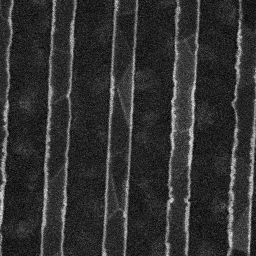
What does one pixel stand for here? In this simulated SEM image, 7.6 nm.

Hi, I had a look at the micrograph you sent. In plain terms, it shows one or a few lines or trenches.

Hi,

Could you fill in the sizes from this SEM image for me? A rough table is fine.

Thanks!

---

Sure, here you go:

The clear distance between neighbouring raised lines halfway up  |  41.1 px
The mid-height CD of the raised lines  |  159 nanometres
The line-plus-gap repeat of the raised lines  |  0.472 micrometres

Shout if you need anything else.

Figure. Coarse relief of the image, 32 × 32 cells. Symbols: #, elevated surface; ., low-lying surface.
##.....##.....###.....###.....##
#......##.....###.....###.....##
#......##.....###.....###.....##
#......##.....###.....###.....##
#......##.....###.....###.....##
#.....###.....###.....###.....##
#.....###.....###.....###.....##
#.....###.....###.....##......##
#.....###.....###.....##......##
#.....###.....###.....##......##
#.....###.....###.....##......##
#.....###.....###.....##.....###
#.....###.....###.....##.....###
#.....###.....###....###.....###
#.....###.....##......##......##
#.....###.....##......##......##
#.....###.....##.....###.....###
#.....###.....##.....###.....###
#.....##......##......##.....###
#.....##......##.....###.....###
#.....##.....###.....###.....###
#.....##.....###.....###.....###
#.....##.....###.....###.....###
#.....##.....###.....###.....###
......##.....###.....###.....##.
......##.....###.....###.....##.
.....###.....###.....###.....##.
.....###.....###.....###.....##.
.....###.....###.....##......##.
.....###.....###.....###.....##.
.....###.....###.....##......##.
.....###.....###.....##......##.